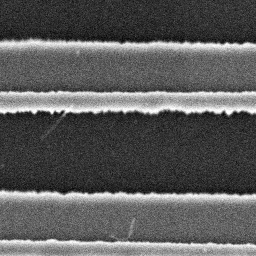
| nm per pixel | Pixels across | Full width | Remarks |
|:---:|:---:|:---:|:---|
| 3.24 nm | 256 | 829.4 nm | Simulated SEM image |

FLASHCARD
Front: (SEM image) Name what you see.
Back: lines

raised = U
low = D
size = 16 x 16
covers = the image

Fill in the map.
DDDDDDDDDDDDDDDD
DDDDDDDDDDDDDDDD
DDDDDDDDDDDDDDDD
UUUUUUUUUUUUUUUU
UUUUUUUUUUUUUUUU
UUUUUUUUUUUUUUUU
UUUUUUUUUUUUUUUU
DDDDDDDDDDDDDDDD
DDDDDDDDDDDDDDDD
DDDDDDDDDDDDDDDD
DDDDDDDDDDDDDDDD
DDDDDDDDDDDDDDDD
UUUUUUUUUUUUUUUU
UUUUUUUUUUUUUUUU
UUUUUUUUUUUUUUUU
UUUUUUUUUUUUUUUU